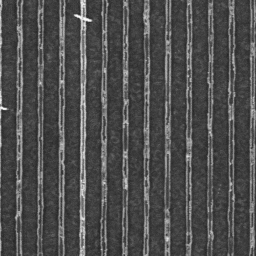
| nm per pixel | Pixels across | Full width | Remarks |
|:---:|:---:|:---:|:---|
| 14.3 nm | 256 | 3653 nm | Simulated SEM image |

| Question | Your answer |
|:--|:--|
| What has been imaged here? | parallel lines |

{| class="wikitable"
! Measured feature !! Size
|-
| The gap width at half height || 16.7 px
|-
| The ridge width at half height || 0.0571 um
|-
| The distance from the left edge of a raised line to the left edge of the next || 302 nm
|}